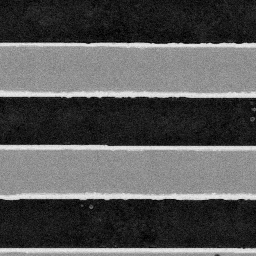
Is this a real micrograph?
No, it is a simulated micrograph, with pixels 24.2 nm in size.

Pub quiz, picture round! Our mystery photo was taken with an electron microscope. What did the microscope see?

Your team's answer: lines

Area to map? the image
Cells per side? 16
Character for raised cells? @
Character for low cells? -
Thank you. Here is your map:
----------------
----------------
----------------
@@@@@@@@@@@@@@@@
@@@@@@@@@@@@@@@@
@@@@@@@@@@@@@@@@
----------------
----------------
----------------
@@@@@@@@@@@@@@@@
@@@@@@@@@@@@@@@@
@@@@@@@@@@@@@@@@
----------------
----------------
----------------
----------------